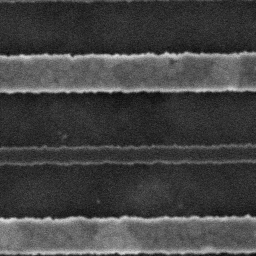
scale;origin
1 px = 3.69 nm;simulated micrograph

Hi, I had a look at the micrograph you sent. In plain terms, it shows lines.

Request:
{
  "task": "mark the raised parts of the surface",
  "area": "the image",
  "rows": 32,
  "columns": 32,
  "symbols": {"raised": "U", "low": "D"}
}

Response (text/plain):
DDDDDDDDDDDDDDDDDDDDDDDDDDDDDDDD
DDDDDDDDDDDDDDDDDDDDDDDDDDDDDDDD
DDDDDDDDDDDDDDDDDDDDDDDDDDDDDDDD
DDDDDDDDDDDDDDDDDDDDDDDDDDDDDDDD
DDDDDDDDDDDDDDDDDDDDDDDDDDDDDDDD
DDDDDDDDDDDDDDDDDDDDDDDDDDDDDDDD
DDDDDDDDDDDDDDDDDDDDDDDDDDDDDDDD
UUUUUUUUUUUUUUUUUUUUUDUUUUUUUUUU
UUUUUUUUUUUUUUUUUUUUUUUUUUUUUUUU
UUUUUUUUUUUUUUUUUUUUUUUUUUUUUUUU
UUUUUUUUUUUUUUUUUUUUUUUUUUUUUUUU
DUDDUDUDDDDDDDDDDDDDDDDDDDDDDDDD
DDDDDDDDDDDDDDDDDDDDDDDDDDDDDDDD
DDDDDDDDDDDDDDDDDDDDDDDDDDDDDDDD
DDDDDDDDDDDDDDDDDDDDDDDDDDDDDDDD
DDDDDDDDDDDDDDDDDDDDDDDDDDDDDDDD
DDDDDDDDDDDDDDDDDDDDDDDDDDDDDDDD
DDDDDDDDDDDDDDDDDDDDDDDDDDDDDDDD
UUUUUUUUUUUUUUUUUUUUUUUUUUUUUUUU
UUUUUUUUUUUUUUUUUUUUUUUUUUUUUUUU
UUUUUDDUUDUDDDDUUDDDDDDDDDDDDDDD
DDDDDDDDDDDDDDDDDDDDDDDDDDDDDDDD
DDDDDDDDDDDDDDDDDDDDDDDDDDDDDDDD
DDDDDDDDDDDDDDDDDDDDDDDDDDDDDDDD
DDDDDDDDDDDDDDDDDDDDDDDDDDDDDDDD
DDDDDDDDDDDDDDDDDDDDDDDDDDDDDDDD
DDDDDDDDDDDDDDDDDDDDDDDDDDDDDDDD
UUUUUUUUUUUUUUUUUUUUUUUUUUUUUUUU
UUUUUUUUUUUUUUUUUUUUUUUUUUUUUUUU
UUUUUUUUUUUUUUUUUUUUUUUUUUUUUUUU
UUUUUUUUUUUUUUUUUUUUUUUUUUUUUUUU
UUUUUUUUUUUUUUUUUUUUUUUUUUUUUUUU